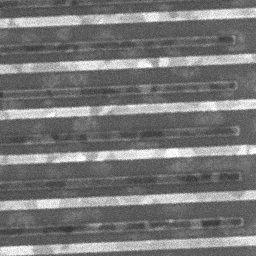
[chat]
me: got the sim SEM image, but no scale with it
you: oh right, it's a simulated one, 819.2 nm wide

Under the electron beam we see parallel lines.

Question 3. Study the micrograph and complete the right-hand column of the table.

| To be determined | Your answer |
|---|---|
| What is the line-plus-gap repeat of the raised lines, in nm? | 72.9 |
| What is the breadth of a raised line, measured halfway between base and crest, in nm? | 25.1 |